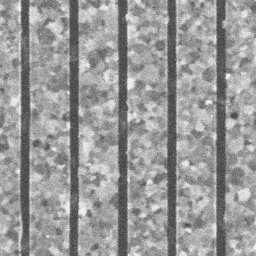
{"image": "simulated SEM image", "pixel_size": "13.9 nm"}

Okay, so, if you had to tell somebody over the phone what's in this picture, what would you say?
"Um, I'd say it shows parallel lines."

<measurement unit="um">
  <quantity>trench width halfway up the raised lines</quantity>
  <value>0.142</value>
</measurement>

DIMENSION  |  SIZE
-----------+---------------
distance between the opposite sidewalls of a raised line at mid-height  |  534 nm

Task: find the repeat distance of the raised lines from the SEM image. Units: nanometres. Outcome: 678